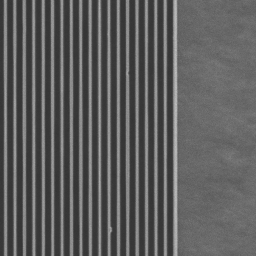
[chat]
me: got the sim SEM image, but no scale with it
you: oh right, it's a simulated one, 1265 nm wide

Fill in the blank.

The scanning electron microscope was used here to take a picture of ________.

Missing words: parallel lines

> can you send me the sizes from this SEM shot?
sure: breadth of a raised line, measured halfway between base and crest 18.8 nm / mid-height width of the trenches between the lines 28.4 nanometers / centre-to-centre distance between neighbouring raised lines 0.0465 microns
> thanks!